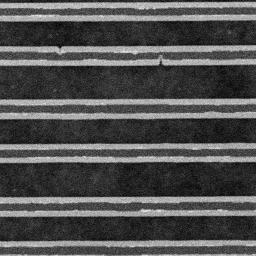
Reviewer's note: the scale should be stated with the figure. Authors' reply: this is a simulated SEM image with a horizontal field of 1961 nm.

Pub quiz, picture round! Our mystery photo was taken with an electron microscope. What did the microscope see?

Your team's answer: parallel lines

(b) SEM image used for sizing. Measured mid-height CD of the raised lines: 113 nanometers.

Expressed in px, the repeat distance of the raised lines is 48.7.